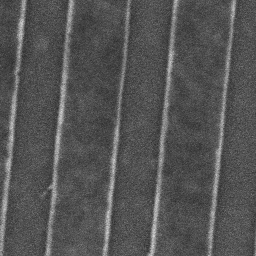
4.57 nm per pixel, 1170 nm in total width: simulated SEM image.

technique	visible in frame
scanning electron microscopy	one or a few lines or trenches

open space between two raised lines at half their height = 204 nanometres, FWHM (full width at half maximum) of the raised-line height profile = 275 nm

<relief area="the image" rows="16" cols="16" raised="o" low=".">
oo..oooo...oooo.
o...oooo...oooo.
o...oooo...ooo..
o...oooo...ooo..
o...oooo...ooo..
o...oooo..oooo..
o...oooo..oooo..
o...ooo...oooo..
o...ooo...oooo..
o..oooo...oooo..
o..oooo...oooo..
o..oooo...oooo..
...oooo...ooo...
...oooo...ooo...
...oooo...ooo...
...oooo..oooo...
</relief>